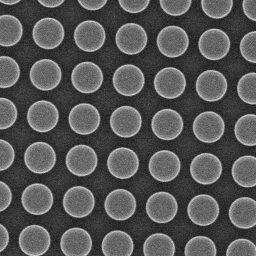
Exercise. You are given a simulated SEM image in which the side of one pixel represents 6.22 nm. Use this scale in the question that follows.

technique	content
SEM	an array of small figures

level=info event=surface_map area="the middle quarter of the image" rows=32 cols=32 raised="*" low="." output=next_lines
...*****.......***..............
..*******....******......****...
..********...*******...*******..
..********..********...*******..
..*******...********...*******..
..*******....*******...*******..
...*****.....******....*******..
..............****......*****...
..........................*.....
................................
...****.........................
..******.....*****.......*......
.********...*******....******...
.********...*******...*******...
.********...*******...********..
..*******...*******...********..
..******....*******...*******...
.............*****.....******...
........................****....
................................
...***..........................
..*****......****...............
.*******....******.....*****....
.*******...*******....******....
.*******...*******...********...
.*******...*******...********...
.******....*******...********...
...***......*****.....******....
..............*........****.....
................................
................................
.*****.......**.................